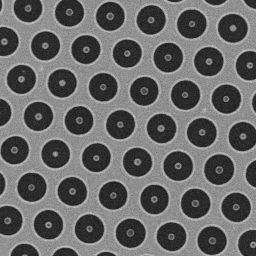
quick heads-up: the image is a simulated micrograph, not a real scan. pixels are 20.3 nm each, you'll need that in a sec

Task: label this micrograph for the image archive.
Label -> an array of small figures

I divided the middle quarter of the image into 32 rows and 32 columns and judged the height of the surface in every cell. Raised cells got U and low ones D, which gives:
UUUUUUUUUUUUUUDDDDUUUUUDDDDDDUUU
DUUUUUUUUUUUUUUUUUUUUUUUDDDDUUUU
DDUUUUUUDDDUUUUUUUUUUUUUUUUUUUUU
DDDUUUUDDDDDDUUUUUDDDDUUUUUUUUUU
DDDUUUDDDDDDDUUUUDDDDDDUUUUUDDDD
DDDUUUDDDUDDDDUUUDDDDDDDUUUDDDDD
DDDUUUDDDDDDDDUUDDDUUDDDUUUDDDDD
DDUUUUDDDDDDDUUUDDDDDDDDUUUDDDUD
UUUUUUUDDDDDUUUUUDDDDDDUUUUDDDDD
UUUUUUUUUDUUUUUUUDDDDDDUUUUDDDDD
UUUDDUUUUUUUUUUUUUUDDUUUUUUUDDDD
UDDDDDUUUUUUUDDUUUUUUUUUUUUUUUDU
DDDDDDDUUUUUDDDDDUUUUUUDDDUUUUUU
DDDDDDDUUUUDDDDDDDUUUDDDDDDUUUUU
DDDUDDDUUUDDDDDDDDUUUDDDDDDDUUUU
DDDDDDDUUUDDDDDDDDUUUDDDDDDDUUUD
UDDDDDDUUUDDDDDDDDUUUDDDDDDDUUUD
UUDDDDUUUUUDDDDDDUUUUDDDDDDDUUDD
UUUUUUUUUUUUDDDDUUUUUDDDDDDUUUUD
UUUUUUUUDUUUUUUUUUUUUUUDDDUUUUUD
DUUUUUDDDDDUUUUUUUUUUUUUUUUUUUUU
DDUUUDDDDDDUUUUUDDDDUUUUUUUUUUUU
DDUUDDDDDDDDUUUDDDDDDDUUUUDDDDDU
DDUUDDDDUDDDUUUDDDDDDDUUUDDDDDDD
DUUUDDDDDDDDUUDDDDUDDDUUUDDDDDDD
UUUUUDDDDDDUUUUDDDDDDDUUUDDDUDDD
UUUUUUDDDDUUUUUDDDDDDDUUUDDDDDDD
UUUUUUUUUUUUUUUUDDDDDUUUUDDDDDDD
DDDDUUUUUUUUUUUUUUUUUUUUUUDDDDDU
DDDDDUUUUUUDDDUUUUUUUUUUUUUUDUUU
DDDDDDUUUUDDDDDUUUUUUDDDDUUUUUUU
DDDDDDUUUDDDDDDDUUUUDDDDDDUUUUUD